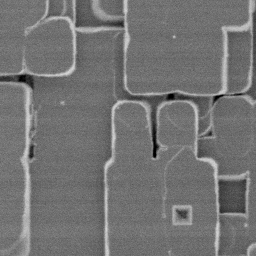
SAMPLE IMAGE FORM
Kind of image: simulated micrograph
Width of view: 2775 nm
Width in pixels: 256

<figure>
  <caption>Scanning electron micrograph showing wiring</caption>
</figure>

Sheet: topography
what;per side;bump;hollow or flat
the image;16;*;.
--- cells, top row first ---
***.....********
****....*******.
*****...******..
*****...******..
****....******..
**......******..
**.....**.**....
**.....*****....
**.....*****....
**.....*****....
**.....******...
**.....*******..
**.....*******..
**.....****.**..
**.....*******..
**.....*******..